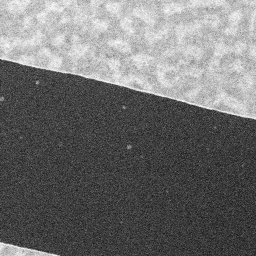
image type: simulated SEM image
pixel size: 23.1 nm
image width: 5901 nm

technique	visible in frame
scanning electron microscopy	one or a few lines or trenches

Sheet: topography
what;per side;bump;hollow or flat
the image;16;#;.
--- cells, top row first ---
################
################
################
################
....############
........########
............####
................
................
................
................
................
................
................
................
#...............